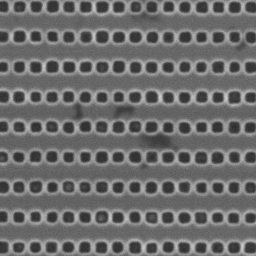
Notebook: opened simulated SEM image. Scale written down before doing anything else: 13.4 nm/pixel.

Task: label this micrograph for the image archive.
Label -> a regular array of holes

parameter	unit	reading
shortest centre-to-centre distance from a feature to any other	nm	218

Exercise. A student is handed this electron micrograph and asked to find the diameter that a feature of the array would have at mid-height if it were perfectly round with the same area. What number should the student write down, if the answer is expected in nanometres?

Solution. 170